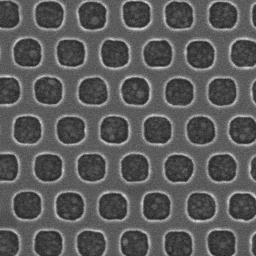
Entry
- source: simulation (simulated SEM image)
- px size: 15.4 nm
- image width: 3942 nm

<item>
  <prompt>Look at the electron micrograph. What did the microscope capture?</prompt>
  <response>a regular array of holes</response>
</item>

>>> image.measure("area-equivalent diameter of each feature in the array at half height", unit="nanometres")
457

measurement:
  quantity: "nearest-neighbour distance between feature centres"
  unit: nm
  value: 662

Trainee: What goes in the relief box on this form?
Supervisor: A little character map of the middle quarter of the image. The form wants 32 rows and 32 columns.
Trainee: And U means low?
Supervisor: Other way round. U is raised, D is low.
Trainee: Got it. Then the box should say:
DDDDUUUUUUDDDDDUUUUUUDDDDDUUUUUU
UUUUUUUUUUUUUUUUUUUUUUUUUUUUUUUU
UUUUUUUUUUUUUUUUUUUUUUUUUUUUUUUU
UUUUUDDDDUUUUUUUDDDUUUUUUUUUDUUU
UUUUDDDDDDUUUUUDDDDDDUUUUUDDDDDD
UUUUDDDDDDDUUUDDDDDDDUUUUUDDDDDD
UUUDDDDDDDDUUUDDDDDDDDUUUDDDDDDD
UUUDDDDDDDDUUUDDDDDDDDUUUDDDDDDD
UUUUDDDDDDDUUUUDDDDDDUUUUDDDDDDD
UUUUDDDDDDUUUUUDDDDDDUUUUUDDDDDD
UUUUUUUUUUUUUUUUUUUUUUUUUUUUDDUU
UUUUUUUUUUUUUUUUUUUUUUUUUUUUUUUU
UUUUUUUUUUUUUUUUUUUUUUUUUUUUUUUU
DDDDUUUUUUDDDDDUUUUUUDDDDUUUUUUU
DDDDDUUUUDDDDDDDUUUUDDDDDDUUUUUD
DDDDDUUUUDDDDDDDUUUUDDDDDDDUUUDD
DDDDDUUUUDDDDDDDUUUUDDDDDDDUUUDD
DDDDDUUUUDDDDDDDUUUUDDDDDDDUUUUD
DDDDDUUUUDDDDDDDUUUUDDDDDDDUUUUD
DDDDUUUUUUDDDDDUUUUUUDDDDDUUUUUU
UUUUUUUUUUUUUUUUUUUUUUUUUUUUUUUU
UUUUUUUUUUUUUUUUUUUUUUUUUUUUUUUU
UUUUUDDDUUUUUUUUUDDUUUUUUUUUUUUU
UUUUDDDDDDUUUUUDDDDDDUUUUUDDDDDU
UUUDDDDDDDUUUUDDDDDDDUUUUDDDDDDD
UUUDDDDDDDDUUUDDDDDDDUUUUDDDDDDD
UUUDDDDDDDDUUUDDDDDDDUUUUDDDDDDD
UUUUDDDDDDUUUUDDDDDDDUUUUDDDDDDD
UUUUDDDDDDUUUUUDDDDDDUUUUUDDDDDD
UUUUUUDDUUUUUUUUDDDUUUUUUUUDDDUU
UUUUUUUUUUUUUUUUUUUUUUUUUUUUUUUU
UUUUUUUUUUUUUUUUUUUUUUUUUUUUUUUU